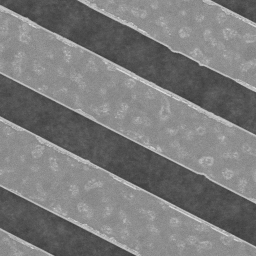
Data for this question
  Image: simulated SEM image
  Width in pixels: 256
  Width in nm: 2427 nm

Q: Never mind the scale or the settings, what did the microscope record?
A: one or a few lines or trenches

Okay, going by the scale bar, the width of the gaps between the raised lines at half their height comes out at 0.377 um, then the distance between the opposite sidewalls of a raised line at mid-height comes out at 0.566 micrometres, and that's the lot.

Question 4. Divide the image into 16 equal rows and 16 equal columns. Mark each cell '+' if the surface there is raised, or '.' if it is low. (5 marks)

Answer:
......++++++++..
++......++++++++
++++......++++++
++++++......++++
++++++++......++
..++++++++......
....++++++++....
......++++++++..
++......++++++++
++++......++++++
++++++......++++
++++++++......++
..++++++++......
....++++++++....
......++++++++..
++......++++++++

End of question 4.